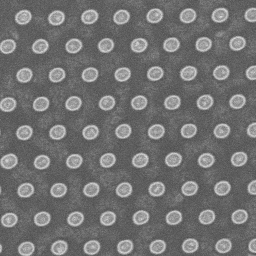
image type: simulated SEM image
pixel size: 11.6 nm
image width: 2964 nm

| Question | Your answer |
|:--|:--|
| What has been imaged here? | a regular array of raised bodies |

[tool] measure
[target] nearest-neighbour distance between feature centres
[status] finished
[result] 32.5 px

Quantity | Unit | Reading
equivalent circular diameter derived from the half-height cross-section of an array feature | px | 14.8